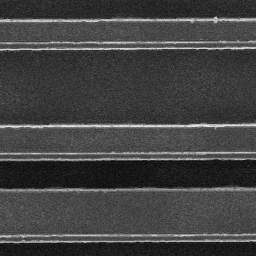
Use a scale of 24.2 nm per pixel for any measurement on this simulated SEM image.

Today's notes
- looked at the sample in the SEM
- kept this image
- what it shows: lines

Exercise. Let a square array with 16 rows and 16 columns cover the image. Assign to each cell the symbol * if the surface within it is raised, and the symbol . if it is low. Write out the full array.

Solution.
................
****************
****************
................
................
................
................
................
****************
****************
................
................
****************
****************
****************
................